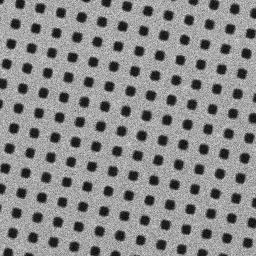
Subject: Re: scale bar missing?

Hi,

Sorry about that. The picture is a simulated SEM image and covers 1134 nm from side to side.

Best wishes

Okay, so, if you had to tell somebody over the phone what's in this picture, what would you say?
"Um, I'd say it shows a regular array of holes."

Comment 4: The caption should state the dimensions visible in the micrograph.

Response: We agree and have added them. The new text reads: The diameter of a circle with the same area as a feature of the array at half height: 49.2 nm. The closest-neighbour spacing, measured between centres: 90.7 nanometres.